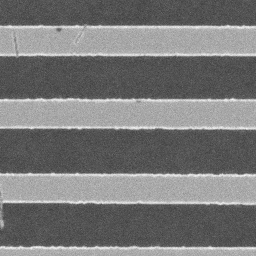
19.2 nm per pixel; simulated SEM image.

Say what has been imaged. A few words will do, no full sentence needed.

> lines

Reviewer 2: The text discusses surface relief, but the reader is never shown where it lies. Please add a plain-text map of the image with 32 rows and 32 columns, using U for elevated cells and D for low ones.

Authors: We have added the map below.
DDDDDDDDDDDDDDDDDDDDDDDDDDDDDDDD
DDDDDDDDDDDDDDDDDDDDDDDDDDDDDDDD
DDDDDDDDDDDDDDDDDDDDDDDDDDDDDDDD
UUUUUUUUUUUUUUUUUUUUUUUUUUUUUUUU
UUUUUUUUUUUUUUUUUUUUUUUUUUUUUUUU
UUUUUUUUUUUUUUUUUUUUUUUUUUUUUUUU
UUUUUUUUUUUUUUUUUUUUUUUUUUUUUUUU
DDDDDDDDDDDDDDDDDDDDDDDDDDDDDDDD
DDDDDDDDDDDDDDDDDDDDDDDDDDDDDDDD
DDDDDDDDDDDDDDDDDDDDDDDDDDDDDDDD
DDDDDDDDDDDDDDDDDDDDDDDDDDDDDDDD
DDDDDDDDDDDDDDDDDDDDDDDDDDDDDDDD
DDDUUUUUUUDDDUUDDDDDDDDDDDDDUUDD
UUUUUUUUUUUUUUUUUUUUUUUUUUUUUUUU
UUUUUUUUUUUUUUUUUUUUUUUUUUUUUUUU
UUUUUUUUUUUUUUUUUUUUUUUUUUUUUUUU
DDDDDDDDDDDDDDDDDDDDDDDDDDDDDDDD
DDDDDDDDDDDDDDDDDDDDDDDDDDDDDDDD
DDDDDDDDDDDDDDDDDDDDDDDDDDDDDDDD
DDDDDDDDDDDDDDDDDDDDDDDDDDDDDDDD
DDDDDDDDDDDDDDDDDDDDDDDDDDDDDDDD
DDDDDDDDDDDDDDDDDDDDDDDDDDDDDDDD
UUUUUUUUUUUUUUUUUUUUUUUUUUUUUUUU
UUUUUUUUUUUUUUUUUUUUUUUUUUUUUUUU
UUUUUUUUUUUUUUUUUUUUUUUUUUUUUUUU
DDDDDDDDDDDDDDDDDDDDDDDDDDDUUUUU
DDDDDDDDDDDDDDDDDDDDDDDDDDDDDDDD
DDDDDDDDDDDDDDDDDDDDDDDDDDDDDDDD
DDDDDDDDDDDDDDDDDDDDDDDDDDDDDDDD
DDDDDDDDDDDDDDDDDDDDDDDDDDDDDDDD
DDDDDDDDDDDDDDDDDDDDDDDDDDDDDDDD
UUUUUUUUUUUUUUUUUUUUUUUUUUUUUUUU